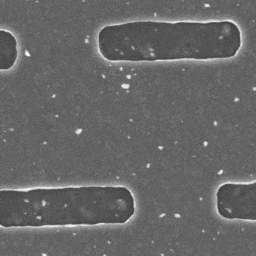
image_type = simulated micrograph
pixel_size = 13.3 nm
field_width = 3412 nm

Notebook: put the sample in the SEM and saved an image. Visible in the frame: holes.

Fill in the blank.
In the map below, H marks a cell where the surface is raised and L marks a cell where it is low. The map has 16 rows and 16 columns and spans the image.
HHHHHHHHHHHHHHHH
HHHHHHHHLLLLLLLH
LHHHHHLLLLLLLLLH
LHHHHHHLLLLLLLHH
HHHHHHHHHHHHHHHH
HHHHHHHHHHHHHHHH
HHHHHHHHHHHHHHHH
HHHHHHHHHHHHHHHH
HHHHHHHHHHHHHHHH
HHHHHHHHHHHHHHHH
HHHHHHHHHHHHHHHH
HHHHHHHHHHHHHHLL
LLLLLLLLHHHHHHLL
LLLLLLLLHHHHHHLL
HHHHHHHHHHHHHHHH
HHHHHHHHHHHHHHHH